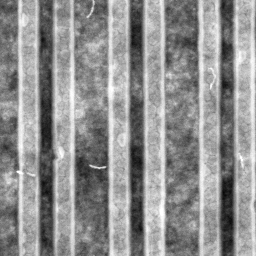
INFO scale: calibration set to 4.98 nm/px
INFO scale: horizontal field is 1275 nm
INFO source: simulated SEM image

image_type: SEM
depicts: parallel lines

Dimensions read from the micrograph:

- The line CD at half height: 93.5 nm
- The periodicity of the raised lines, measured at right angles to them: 215 nm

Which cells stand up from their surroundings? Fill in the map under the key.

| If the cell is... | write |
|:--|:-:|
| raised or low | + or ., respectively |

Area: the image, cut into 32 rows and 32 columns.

..+++..++.....++..++.....++..+++
..+++..++.....++..++.....++..+++
..+++..++.....++..++.....++..+++
...++..++.....++..++.....++..+++
..+++..++.....++..++.....++..+++
..+++..++.....++..++.....++..+++
...++..++.....++..++.....++..+++
...++..++.....++..++.....++..+++
...++..++.....++..++.....++..+++
...++..++.....++..++.....++...++
...++..++.....++..++.....++...++
...++..++.....++..++.....++..+++
...++..++.....++..++.....++..+++
...++..++.....++..++.....++..+++
...++..++.....++..++.....++..+++
...++..++.....++..++.....++..+++
...++..++.....++..++.....++..+++
...++..++.....++..++.....++..+++
...++..++.....++..++.....++..+++
...++..++.....++..++.....++..+++
...++..++.....++..++.....++..+++
..+++..++.....++..++.....++..+++
...++..++.....++..++.....++..+++
...++..++.....++..++.....++..+++
...++..++.....++..++.....++..+++
...++..++.....++..++.....++..+++
...++..++.....++..++.....++..+++
...++..++.....++..++.....++..+++
...++..++.....++..++.....++..+++
...++..++.....++..++.....++..+++
...++..++.....++..++.....++..+++
...++..++.....++..++.....++..+++